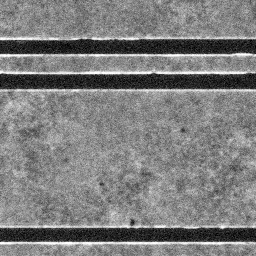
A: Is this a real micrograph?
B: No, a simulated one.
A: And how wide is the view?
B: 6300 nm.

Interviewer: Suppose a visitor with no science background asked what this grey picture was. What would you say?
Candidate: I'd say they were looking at lines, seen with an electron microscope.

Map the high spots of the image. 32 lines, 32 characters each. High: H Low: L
HHHHHHHHHHHHHHHHHHHHHHHHHHHHHHHH
HHHHHHHHHHHHHHHHHHHHHHHHHHHHHHHH
HHHHHHHHHHHHHHHHHHHHHHHHHHHHHHHH
HHHHHHHHHHHHHHHHHHHHHHHHHHHHHHHH
HHHHHHHHHHHHHHHHHHHHHHHHHHHHHHHH
LLLLLLLLLLLLLLLLLLLLLLLLLLLLLLLL
LLLLLLLLLLLLLLLLLLLLLLLLLLLLLLLL
HHHHHHHHHHHHHHHHHHHHHHHHHHHHHHHH
HHHHHHHHHHHHHHHHHHHHHHHHHHHHHHHH
LLLLLLLLLLLLLLLLLLLLLLLLLLLLLLLL
LLLLLLLLLLLLLLLLLLLLLLLLLLLLLLLL
HHHHHHHHHHHHHHHHHHHHHHHHHHHHHHHH
HHHHHHHHHHHHHHHHHHHHHHHHHHHHHHHH
HHHHHHHHHHHHHHHHHHHHHHHHHHHHHHHH
HHHHHHHHHHHHHHHHHHHHHHHHHHHHHHHH
HHHHHHHHHHHHHHHHHHHHHHHHHHHHHHHH
HHHHHHHHHHHHHHHHHHHHHHHHHHHHHHHH
HHHHHHHHHHHHHHHHHHHHHHHHHHHHHHHH
HHHHHHHHHHHHHHHHHHHHHHHHHHHHHHHH
HHHHHHHHHHHHHHHHHHHHHHHHHHHHHHHH
HHHHHHHHHHHHHHHHHHHHHHHHHHHHHHHH
HHHHHHHHHHHHHHHHHHHHHHHHHHHHHHHH
HHHHHHHHHHHHHHHHHHHHHHHHHHHHHHHH
HHHHHHHHHHHHHHHHHHHHHHHHHHHHHHHH
HHHHHHHHHHHHHHHHHHHHHHHHHHHHHHHH
HHHHHHHHHHHHHHHHHHHHHHHHHHHHHHHH
HHHHHHHHHHHHHHHHHHHHHHHHHHHHHHHH
HHHHHHHHHHHHHHHHHHHHHHHHHHHHHHHH
LLLLLLLLLLLLLLLLLLLLLLLLLLLLLLLL
LLLLLLLLLLLLLLLLLLLLLLLLLLLLLLLL
HHHHHHHHHHHHHHHHHHHHHHHHHHHHHHHH
HHHHHHHHHHHHHHHHHHHHHHHHHHHHHHHH